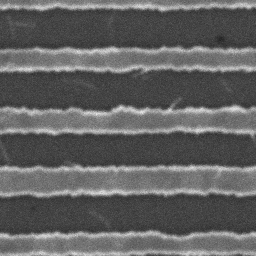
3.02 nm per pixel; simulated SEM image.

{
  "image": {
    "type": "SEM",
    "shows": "one or a few lines or trenches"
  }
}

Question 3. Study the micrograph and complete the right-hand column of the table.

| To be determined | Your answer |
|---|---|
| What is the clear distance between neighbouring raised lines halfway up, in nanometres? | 123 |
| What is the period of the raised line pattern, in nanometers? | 185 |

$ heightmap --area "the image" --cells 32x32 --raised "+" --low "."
++++++++++++++++++++++++++++++++
................................
................................
................................
................................
................................
++++++++++++++++++++++++++++++++
++++++++++++++++++++++++++++++++
+++++++++++++++++.++++++++++++.+
................................
................................
................................
................................
.............................+..
++++++++++++++++++++++++++++++++
++++++++++++++++++++++++++++++++
+.....++.+..++++++++.........+++
................................
................................
................................
................................
++++++++++++++++++++++++++++++++
++++++++++++++++++++++++++++++++
++++++++++++++++++++++++++++++++
.....+..........................
................................
................................
................................
................................
+..++++++++++++++++++...++++++++
++++++++++++++++++++++++++++++++
++++++++++++++++++++++++++++++++